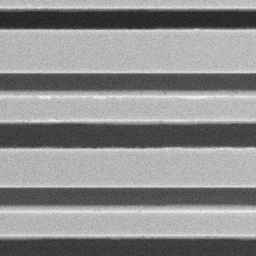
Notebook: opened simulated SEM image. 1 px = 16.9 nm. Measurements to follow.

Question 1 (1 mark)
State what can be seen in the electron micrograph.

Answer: lines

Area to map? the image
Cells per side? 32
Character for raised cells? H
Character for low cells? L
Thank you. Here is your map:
HHHHHHHHHHHHHHHHHHHHHHHHHHHHHHHH
LLLLLLLLLLLLLLLLLLLLLLLLLLLLLLLL
LLLLLLLLLLLLLLLLLLLLLLLLLLLLLLLL
LLLLLLLLLLLLLLLLLLLLLLLLLLLLLLLL
HHHHHHHHHHHHHHHHHHHHHHHHHHHHHHHH
HHHHHHHHHHHHHHHHHHHHHHHHHHHHHHHH
HHHHHHHHHHHHHHHHHHHHHHHHHHHHHHHH
HHHHHHHHHHHHHHHHHHHHHHHHHHHHHHHH
HHHHHHHHHHHHHHHHHHHHHHHHHHHHHHHH
LLLLLLLLLLLLLLLLLLLLLLLLLLLLLLLL
LLLLLLLLLLLLLLLLLLLLLLLLLLLLLLLL
LLLLLLLLLLLLLLLLLLLLLLLLLLLLLLLL
HHHHHHHHHHHHHHHHHHHHHHHHHHHHHHHH
HHHHHHHHHHHHHHHHHHHHHHHHHHHHHHHH
HHHHHHHHHHHHHHHHHHHHHHHHHHHHHHHH
LLLLLLLLLLLLLLLLLLLLLLLLLLLLLLLL
LLLLLLLLLLLLLLLLLLLLLLLLLLLLLLLL
LLLLLLLLLLLLLLLLLLLLLLLLLLLLLLLL
LLLLLLLLLLLLLLLLLLLLLLLLLLLLLLLL
HHHHHHHHHHHHHHHHHHHHHHHHHHHHHHHH
HHHHHHHHHHHHHHHHHHHHHHHHHHHHHHHH
HHHHHHHHHHHHHHHHHHHHHHHHHHHHHHHH
HHHHHHHHHHHHHHHHHHHHHHHHHHHHHHHH
LLLLLLLLLLLLLLLLLLLLLLLLLLLLLLLL
LLLLLLLLLLLLLLLLLLLLLLLLLLLLLLLL
LLLLLLLLLLLLLLLLLLLLLLLLLLLLLLLL
HHHHHHHHHHHHHHHHHHHHHHHHHHHHHHHH
HHHHHHHHHHHHHHHHHHHHHHHHHHHHHHHH
HHHHHHHHHHHHHHHHHHHHHHHHHHHHHHHH
HHHHHLLLLLLLLLLLLLLLLLLLLLLLLLLL
LLLLLLLLLLLLLLLLLLLLLLLLLLLLLLLL
LLLLLLLLLLLLLLLLLLLLLLLLLLLLLLLL